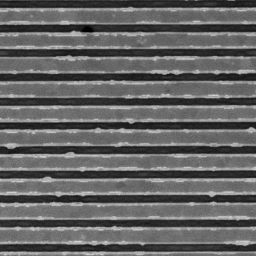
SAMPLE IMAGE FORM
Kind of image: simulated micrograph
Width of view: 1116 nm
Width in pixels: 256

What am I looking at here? parallel lines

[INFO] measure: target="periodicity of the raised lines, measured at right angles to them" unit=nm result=106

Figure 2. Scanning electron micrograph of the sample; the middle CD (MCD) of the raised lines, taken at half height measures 69.3 nanometres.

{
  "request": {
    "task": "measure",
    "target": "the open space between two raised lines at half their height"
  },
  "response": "38.2 nm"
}